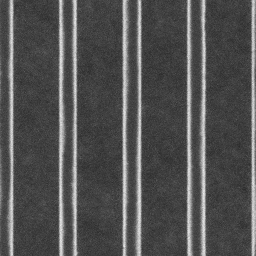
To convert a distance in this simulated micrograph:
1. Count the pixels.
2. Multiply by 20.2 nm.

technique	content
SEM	lines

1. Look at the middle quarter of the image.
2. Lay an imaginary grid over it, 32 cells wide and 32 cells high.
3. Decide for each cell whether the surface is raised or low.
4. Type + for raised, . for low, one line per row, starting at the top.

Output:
+++............++++............+
+++............++++............+
+++............++++............+
+++............++++............+
+++............++++............+
+++............++++............+
+++............++++............+
+++............++++............+
+++............++++............+
+++............++++............+
+++............++++............+
+++............++++............+
+++............++++............+
+++............++++............+
+++............++++............+
+++............++++............+
+++............++++............+
+++............++++............+
+++............++++............+
+++............++++............+
+++............++++............+
+++............++++............+
+++............++++............+
+++............++++............+
+++............++++............+
+++............++++............+
+++............++++............+
+++............++++............+
+++............++++............+
+++............++++............+
+++............++++............+
+++............++++............+